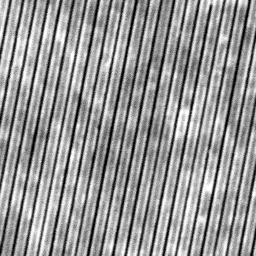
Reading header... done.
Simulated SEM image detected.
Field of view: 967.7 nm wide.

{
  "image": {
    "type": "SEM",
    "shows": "parallel lines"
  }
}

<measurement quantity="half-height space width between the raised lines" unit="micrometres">0.0139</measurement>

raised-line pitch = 46.7 nanometers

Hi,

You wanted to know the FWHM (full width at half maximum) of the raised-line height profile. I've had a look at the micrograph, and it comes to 8.23 pixels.